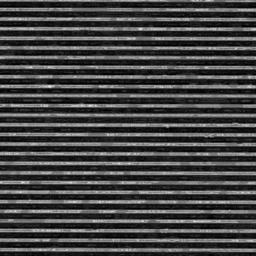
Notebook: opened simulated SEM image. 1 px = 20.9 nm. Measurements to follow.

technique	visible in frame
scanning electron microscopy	parallel lines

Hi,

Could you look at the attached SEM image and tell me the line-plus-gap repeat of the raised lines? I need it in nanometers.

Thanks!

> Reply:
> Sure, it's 201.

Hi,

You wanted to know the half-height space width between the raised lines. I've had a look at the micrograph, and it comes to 146 nm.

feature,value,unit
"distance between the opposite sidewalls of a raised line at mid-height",54.8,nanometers